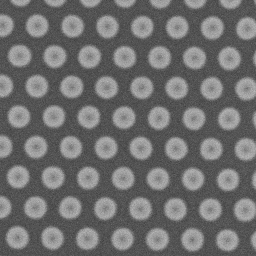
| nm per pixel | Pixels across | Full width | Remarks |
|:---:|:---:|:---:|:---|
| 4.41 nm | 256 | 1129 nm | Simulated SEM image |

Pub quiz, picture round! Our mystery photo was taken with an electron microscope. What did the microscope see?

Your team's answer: an array of small figures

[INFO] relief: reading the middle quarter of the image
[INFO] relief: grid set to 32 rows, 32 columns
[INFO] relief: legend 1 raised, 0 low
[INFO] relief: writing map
00000111000000111000001111000001
00000000000000000000000000000000
00000000000000000000000000000000
11100000011100000011100000011000
11110000111110000111110000111100
11111000111110000111110000111110
11111000111110000111110000111110
11110000011110000111110000111100
00000000000000000001000000011000
00000000000000000000000000000000
00000000000000000000000000000000
00001111000001111000001111000001
00001111100011111100011111000011
00001111100011111100011111000011
00001111100001111100011111000011
00000111000001111000001110000001
00000000000000000000000000000000
00000000000000000000000000000000
11100000011100000011000000000000
11110000111110000111100000111100
11110000111110000111110000111110
11110000111110000111110000111110
11110000111110000111110000111100
01000000011000000011000000011000
00000000000000000000000000000000
00000000000000000000000000000000
00001111000001110000001110000001
00001111000011111000011111000011
00001111100011111000011111000011
00001111000011111000011111000011
00001111000001111000001111000011
00000000000000000000000000000000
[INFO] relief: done